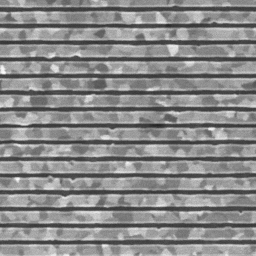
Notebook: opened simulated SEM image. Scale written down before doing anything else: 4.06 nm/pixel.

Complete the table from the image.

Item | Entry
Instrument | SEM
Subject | parallel lines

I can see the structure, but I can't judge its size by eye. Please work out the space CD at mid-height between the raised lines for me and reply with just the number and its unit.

22.9 nanometers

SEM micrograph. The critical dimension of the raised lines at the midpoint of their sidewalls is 45.7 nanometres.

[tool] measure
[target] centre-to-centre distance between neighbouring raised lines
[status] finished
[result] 67.5 nm